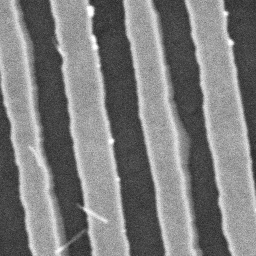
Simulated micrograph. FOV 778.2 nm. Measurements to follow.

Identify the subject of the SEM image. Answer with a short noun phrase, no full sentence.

lines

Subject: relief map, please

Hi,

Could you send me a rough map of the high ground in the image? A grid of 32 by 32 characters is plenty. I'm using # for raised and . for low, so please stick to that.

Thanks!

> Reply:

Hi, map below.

##....#####....####....#####....
##.....#####....###.....####....
##.....####.....####....####....
###....####.....####....####....
###....#####....####....#####...
###....#####....####....#####...
####...#####.....###.....####...
####....####.....###.....####...
####....####.....####....####...
####....#####....####....#####..
####....#####....####....#####..
####....#####....####....#####..
.###.....####....####.....####..
.###.....####....####....#####..
.####....####....#####....####..
.####....#####....####....#####.
.####....#####....####....#####.
.####....#####....#####...#####.
..###....#####....#####...#####.
..###....#####....#####....####.
..####....####.....####....####.
..####....#####....####....####.
..####....#####....####....#####
..####....#####....####....#####
...###....#####.....###....#####
...####....####.....####...#####
...####....####.....####....####
...####....####.....####....####
...####....#####....####....####
....###....#####....####....####
....####...#####....####.....###
....####....####.....####....###